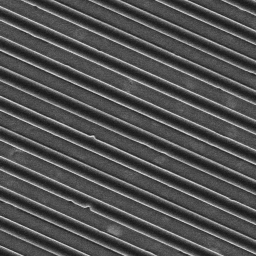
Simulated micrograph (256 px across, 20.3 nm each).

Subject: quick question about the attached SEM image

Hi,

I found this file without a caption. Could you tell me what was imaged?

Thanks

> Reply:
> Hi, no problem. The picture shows parallel lines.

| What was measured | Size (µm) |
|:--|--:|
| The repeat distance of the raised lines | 0.554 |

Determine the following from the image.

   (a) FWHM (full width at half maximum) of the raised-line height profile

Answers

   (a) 12.7 pixels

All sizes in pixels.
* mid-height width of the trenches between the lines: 14.5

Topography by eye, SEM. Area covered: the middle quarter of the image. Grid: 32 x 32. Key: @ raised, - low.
@---------@@@@@@@---------@@@@@@
@@@---------@@@@@@@----------@@@
@@@@@---------@@@@@@@@---------@
@@@@@@@---------@@@@@@@@--------
--@@@@@@@@---------@@@@@@@------
----@@@@@@@@---------@@@@@@@----
------@@@@@@@@---------@@@@@@@@-
---------@@@@@@@---------@@@@@@@
@@---------@@@@@@@@---------@@@@
@@@@---------@@@@@@@@---------@@
@@@@@@---------@@@@@@@@---------
@@@@@@@@@---------@@@@@@@-------
---@@@@@@@@---------@@@@@@@-----
-----@@@@@@@@---------@@@@@@@@--
-------@@@@@@@@---------@@@@@@@@
---------@@@@@@@@@---------@@@@@
@@@---------@@@@@@@@---------@@@
@@@@@---------@@@@@@@@---------@
@@@@@@@@--------@@@@@@@@--------
--@@@@@@@---------@@@@@@@@------
----@@@@@@@----------@@@@@@@@---
------@@@@@@@@---------@@@@@@@@-
--------@@@@@@@@---------@@@@@@@
@@---------@@@@@@@---------@@@@@
@@@@---------@@@@@@@----------@@
@@@@@@---------@@@@@@@@---------
-@@@@@@@---------@@@@@@@@-------
---@@@@@@@@---------@@@@@@@-----
-----@@@@@@@@---------@@@@@@@---
-------@@@@@@@@---------@@@@@@@@
@---------@@@@@@@---------@@@@@@
@@@---------@@@@@@@----------@@@